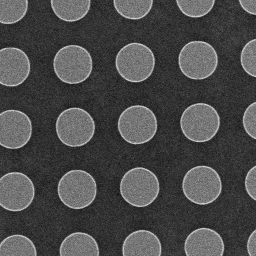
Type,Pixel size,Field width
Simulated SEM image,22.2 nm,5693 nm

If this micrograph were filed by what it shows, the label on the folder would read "an array of small figures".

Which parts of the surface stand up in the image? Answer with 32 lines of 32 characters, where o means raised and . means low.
ooo...ooooo...ooooo...ooooo...oo
ooo....oooo....oooo....ooo.....o
oo......oo......................
................................
................................
................oo......oo.....o
ooo....oooo....oooo....oooo...oo
oooo...oooo....oooo...ooooo...oo
oooo...oooo....oooo....oooo...oo
ooo....oooo....oooo....ooo......
oo..............................
................................
................................
................oo.....oooo....o
ooo....oooo....oooo....oooo...oo
oooo...ooooo...ooooo...oooo...oo
oooo...ooooo...oooo....oooo....o
oooo....ooo.....ooo.....oo......
................................
................................
................................
.........oo.....ooo.....ooo....o
oooo....oooo...ooooo...oooo....o
oooo...ooooo...ooooo...ooooo...o
oooo...ooooo...ooooo...oooo....o
oooo....ooo.....ooo......o......
................................
................................
................................
..o......oo.....ooo.....ooo....o
oooo....oooo...ooooo...ooooo...o
oooo....oooo...ooooo...ooooo...o